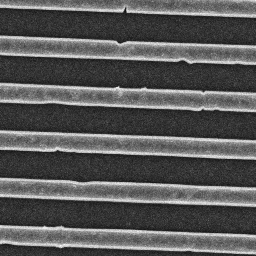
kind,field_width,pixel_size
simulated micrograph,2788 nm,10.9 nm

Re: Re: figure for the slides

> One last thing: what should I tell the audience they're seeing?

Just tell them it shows parallel lines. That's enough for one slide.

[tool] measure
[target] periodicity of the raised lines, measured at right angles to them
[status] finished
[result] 514 nanometres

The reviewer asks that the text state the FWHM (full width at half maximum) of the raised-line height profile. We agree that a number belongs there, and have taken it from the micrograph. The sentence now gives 189 nm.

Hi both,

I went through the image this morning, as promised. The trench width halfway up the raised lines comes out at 29.5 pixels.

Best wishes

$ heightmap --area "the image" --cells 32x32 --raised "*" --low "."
********************************
.................***************
................................
................................
................................
********************............
********************************
.....................*.*********
................................
................................
................................
************************........
********************************
......................**********
................................
................................
**..............................
****************************....
********************************
.......................*********
................................
................................
***.............................
*****************************...
.*******************************
...........................*****
................................
................................
******.*........................
********************************
...*****************************
.............................***